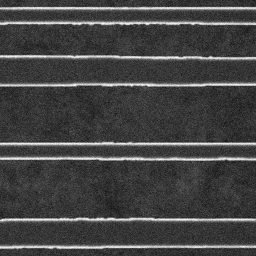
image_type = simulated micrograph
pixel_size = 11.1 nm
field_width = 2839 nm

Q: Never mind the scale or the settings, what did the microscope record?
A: lines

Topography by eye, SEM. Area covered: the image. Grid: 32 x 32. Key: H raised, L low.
LLLLLLLLLLLLLLLLLLLLLLLLLLLLLLLL
HHHHHHHHHHHHHHHHHHHHHHHHHHHHHHHH
HHHHHHHHHHHHHHHHHHHHHHHHHHHHHHHH
LLLLLLLLLLLLLLLLLLLLLLLLLLLLLLLL
LLLLLLLLLLLLLLLLLLLLLLLLLLLLLLLL
LLLLLLLLLLLLLLLLLLLLLLLLLLLLLLLL
LLLLLLLLLLLLLLLLLLLLLLLLLLLLLLLL
HHHHHHHHHHHHHHHHHHHHHHHHHHHHHHHH
HHHHHHHHHHHHHHHHHHHHHHHHHHHHHHHH
HHHHHHHHHHHHHHHHHHHHHHHHHHHHHHHH
HHHHHHHHHHHHHHHHHHHHHHHHHHHHHHHH
LLLLLLLLLLLLLLLLLLLLLLLLLLLLLLLL
LLLLLLLLLLLLLLLLLLLLLLLLLLLLLLLL
LLLLLLLLLLLLLLLLLLLLLLLLLLLLLLLL
LLLLLLLLLLLLLLLLLLLLLLLLLLLLLLLL
LLLLLLLLLLLLLLLLLLLLLLLLLLLLLLLL
LLLLLLLLLLLLLLLLLLLLLLLLLLLLLLLL
LLLLLLLLLLLLLLLLLLLLLLLLLLLLLLLL
HHHHHHHHHHHHHHHHHHHHHHHHHHHHHHHH
HHHHHHHHHHHHHHHHHHHHHHHHHHHHHHHH
LLLLLLLLLLLLLLLLLLLLLLLLLLLLLLLL
LLLLLLLLLLLLLLLLLLLLLLLLLLLLLLLL
LLLLLLLLLLLLLLLLLLLLLLLLLLLLLLLL
LLLLLLLLLLLLLLLLLLLLLLLLLLLLLLLL
LLLLLLLLLLLLLLLLLLLLLLLLLLLLLLLL
LLLLLLLLLLLLLLLLLLLLLLLLLLLLLLLL
LLLLLLLLLLLLLLLLLLLLLLLLLLLLLLLL
HHHHHHHHHHHHHHHHHHHHHHHHHHHHHHHH
HHHHHHHHHHHHHHHHHHHHHHHHHHHHHHHH
HHHHHHHHHHHHHHHHHHHHHHHHHHHHHHHH
HHHHHHHHHHHHHHHHHHHHHHHHHHHHHHHH
LLLLLLLLLLLLLLLLLLLLLLLLLLLLLLLL